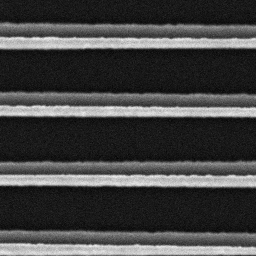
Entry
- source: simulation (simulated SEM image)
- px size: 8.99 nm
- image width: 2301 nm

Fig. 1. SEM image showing lines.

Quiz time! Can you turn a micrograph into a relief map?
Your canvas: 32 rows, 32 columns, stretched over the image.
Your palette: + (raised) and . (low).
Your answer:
................................
................................
................................
++++++++++++++++++++++++++++++++
++++++++++++++++++++++++++++++++
++++++++++++++++++++++++++++++++
................................
................................
................................
................................
................................
................................
++++++++++++++++++++++++++++++++
++++++++++++++++++++++++++++++++
.................+.......++..+++
................................
................................
................................
................................
................................
++.++++..++++..+++++++++++++++++
++++++++++++++++++++++++++++++++
++++++++++++++++++++++++++++++++
................................
................................
................................
................................
................................
................................
++++++++++++++++++++++++++++++++
++++++++++++++++++++++++++++++++
++++++++++++++++++++++++++++++++